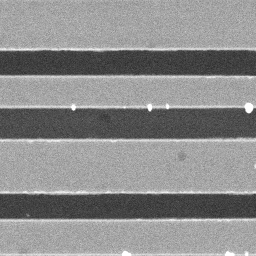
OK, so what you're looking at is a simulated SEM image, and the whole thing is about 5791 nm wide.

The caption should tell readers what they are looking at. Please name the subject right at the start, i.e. lines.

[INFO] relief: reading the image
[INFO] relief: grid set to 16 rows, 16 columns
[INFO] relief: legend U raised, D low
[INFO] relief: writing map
UUUUUUUUUUUUUUUU
UUUUUUUUUUUUUUUU
UUUUUUUUUUUUUUUU
DDDDDDDDDDDDDDDD
DDDDDDDDDDDDDDDD
UUUUUUUUUUUUUUUU
UUUUUUUUUUUUUUUU
DDDDDDDDDDDDDDDD
DDDDDDDDDDDDDDDD
UUUUUUUUUUUUUUUU
UUUUUUUUUUUUUUUU
UUUUUUUUUUUUUUUU
DDDDDDDDDDDDDDDD
DDDDDDDDDDDDDDDD
UUUUUUUUUUUUUUUU
UUUUUUUUUUUUUUUU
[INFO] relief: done